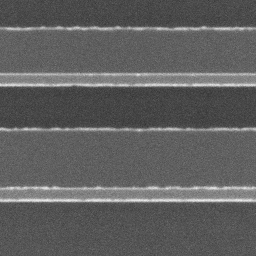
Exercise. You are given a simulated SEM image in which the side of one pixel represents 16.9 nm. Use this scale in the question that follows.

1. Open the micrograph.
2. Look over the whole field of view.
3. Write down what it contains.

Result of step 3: lines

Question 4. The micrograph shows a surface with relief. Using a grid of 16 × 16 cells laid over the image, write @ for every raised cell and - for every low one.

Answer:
----------------
----------------
@@@@@@@@@@@@@@@@
@@@@@@@@@@@@@@@@
@@@@@@@@@@@@@@@@
----------------
----------------
----------------
@@@@@@@@@@@@@@@@
@@@@@@@@@@@@@@@@
@@@@@@@@@@@@@@@@
@@@@@@@@@@@@@@@@
@@@@@@@@@@@@@@@@
----------------
----------------
----------------